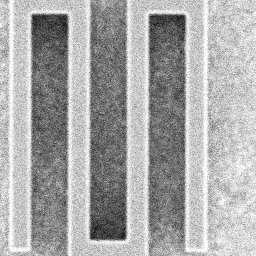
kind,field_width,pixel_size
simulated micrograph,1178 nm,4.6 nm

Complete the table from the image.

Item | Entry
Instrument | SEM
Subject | groups of lines, slits or small figures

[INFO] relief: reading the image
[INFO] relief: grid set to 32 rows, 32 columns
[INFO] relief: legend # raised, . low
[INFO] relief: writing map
.##########.....##########......
.##########.....##########......
.###.....##.....##.....###......
.###.....##.....##.....###......
.###.....##.....##.....###......
.###.....##.....##.....###......
.###.....##.....##.....###......
.###.....##.....##.....###......
.###.....##.....##.....###......
.###.....##.....##.....###......
.###.....##.....##.....###......
.###.....##.....##.....###......
.###.....##.....##.....###......
.###.....##.....##.....###......
.###.....##.....##.....###......
.###.....##.....##.....###......
.###.....##.....##.....###......
.###.....##.....##.....###......
.###.....##.....##.....###......
.###.....##.....##.....###......
.###.....##.....##.....###......
.###.....##.....##.....###......
.###.....##.....##.....###......
.###.....##.....##.....###......
.###.....##.....##.....###......
.###.....##.....##.....###......
.###.....##.....##.....###......
.###.....##.....##.....###......
.###.....##.....##.....###......
.###.....##.....##.....###......
.###.....#########.....###......
.........#########..............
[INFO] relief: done